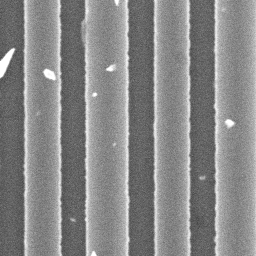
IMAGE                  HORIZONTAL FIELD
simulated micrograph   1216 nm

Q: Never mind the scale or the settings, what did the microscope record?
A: lines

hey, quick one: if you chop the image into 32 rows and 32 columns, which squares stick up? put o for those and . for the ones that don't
...oooo....ooooo...ooooo...ooooo
...oooo....ooooo...ooooo...ooooo
...oooo....ooooo...ooooo...ooooo
...ooooo...ooooo...ooooo...ooooo
...ooooo...ooooo...ooooo...ooooo
...ooooo...ooooo...ooooo...ooooo
...oooo....ooooo...ooooo...ooooo
o..ooooo...ooooo...ooooo...ooooo
o..oooo....ooooo...ooooo...ooooo
...ooooo...ooooo...ooooo...ooooo
...ooooo...ooooo...ooooo...ooooo
...ooooo...ooooo...ooooo...ooooo
...ooooo...ooooo...ooooo...ooooo
...ooooo...ooooo...ooooo...ooooo
...ooooo...ooooo...ooooo...ooooo
...ooooo...ooooo...ooooo...ooooo
...ooooo...ooooo...ooooo...ooooo
...ooooo...ooooo...ooooo...ooooo
...ooooo...ooooo...ooooo...ooooo
...ooooo...ooooo...ooooo...ooooo
...ooooo...ooooo...ooooo...ooooo
...ooooo...ooooo...ooooo...ooooo
...ooooo...ooooo...ooooo...ooooo
...ooooo...ooooo....oooo...ooooo
...ooooo...ooooo...ooooo...ooooo
...ooooo...ooooo...ooooo...ooooo
...ooooo...ooooo...ooooo...ooooo
...ooooo...ooooo...ooooo...ooooo
...ooooo...ooooo...ooooo...ooooo
...ooooo...ooooo...ooooo...ooooo
...ooooo...ooooo...ooooo...ooooo
...ooooo...ooooo...ooooo...ooooo